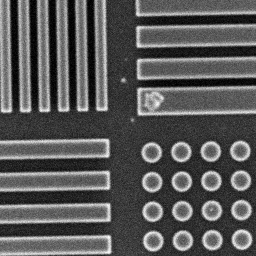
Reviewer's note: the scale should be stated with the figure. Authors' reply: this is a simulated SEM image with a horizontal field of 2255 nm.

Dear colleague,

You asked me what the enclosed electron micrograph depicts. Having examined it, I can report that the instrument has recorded groups of lines, slits or small figures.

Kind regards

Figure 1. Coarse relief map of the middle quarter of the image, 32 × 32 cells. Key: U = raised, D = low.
UDDUUUDDUUDDDDDDDDDUUUUUUUUUUUUU
UDDUUUDDUUDDDDDDDDDUUUUUUUUUUUUU
UDDUUUDDUUDDDDDDDDDUUUUUUUUUUUUU
UDDUUUDDUUDDDDDDDDDUUUUUUDDDDDDD
UDDUUUDDUUDDDDDDDDDDDDDDDDDDDDDD
UDDUUUDDUUUDDDDDDDDDDDDDDDDDDDDD
UDDUUUDDUUUDDDDDDDDUUUUUUUUUUUUU
UDDUUUDDUUUDDDDDDDDUUUUUUUUUUUUU
UDDUUUDDUUUDDDDDDDDUUUUUUUUUUUUU
UDDUUUDDUUUDDDDDDDDUUUUUUUUUUUUU
UDDUUUDDUUUDDDDDDDDUUUUUUUUUUUUU
UDDUUUDDDUDDDDDDDDDUUUUUUUUUUUUU
DDDDDDDDDDDDDDDDDDDUDDDDDDDDDDDD
DDDDDDDDDDDDDDDDDDDDDDDDDDDDDDDD
DDDDDDDDDDDDDDDDDDDDDDDDDDDDDDDD
DDDDDDDDDDDDDDDDDDDDDDDDDDDDDDDD
DDDDDDDDDDDDDDDDDDDDDDDDDDDDDDDD
DDDDDDDDDDDDDDDDDDDDDDDDDDDDDDDD
DDDDDDDDDDDDDDDDDDDDDDDDDDDDDDDD
UUUUUUUUUUUDDDDDDDDDDDDDDDDDDDDD
UUUUUUUUUUUDDDDDDDDDUUUUDDDDUUUD
UUUUUUUUUUUDDDDDDDDDUUUUDDDUUUUU
UUUUUUUUUUUDDDDDDDDDUUUUDDDUUUUU
DDDDDDDDDDDDDDDDDDDDUUUUDDDDUUUD
DDDDDDDDDDDDDDDDDDDDDUUDDDDDDDDD
DDDDDDDDDDDDDDDDDDDDDDDDDDDDDDDD
DDDDDDDDDDDDDDDDDDDDDDDDDDDDDDDD
UUUUUUUUUUUDDDDDDDDDDUUDDDDDUUUD
UUUUUUUUUUUDDDDDDDDDUUUUDDDUUUUU
UUUUUUUUUUUDDDDDDDDDUUUUDDDUUUUU
UUUUUUUUUUUDDDDDDDDDUUUUDDDUUUUU
DDDDDDDDDDDDDDDDDDDDDUUDDDDDUUDD